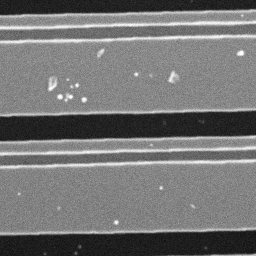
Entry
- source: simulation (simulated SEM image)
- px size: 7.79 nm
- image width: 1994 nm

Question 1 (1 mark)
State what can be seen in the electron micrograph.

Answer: lines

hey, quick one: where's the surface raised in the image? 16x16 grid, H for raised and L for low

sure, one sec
LLLLLLLLLLLLLLLL
HHHHHHHHHHHHHHHH
HHHHHHHHHHHHHHHH
HHHHHHHHHHHHHHHH
HHHHHHHHHHHHHHHH
HHHHHHHHHHHHHHHH
HHHHHHHHHHHHHHHH
LLLLLLLLLLLLLLLL
LLLLLLLLLLLLLLLL
HHHHHHHHHHHHHHHH
HHHHHHHHHHHHHHHH
HHHHHHHHHHHHHHHH
HHHHHHHHHHHHHHHH
HHHHHHHHHHHHHHHH
HHHHHHHHHHLLLLLL
LLLLLLLLLLLLLLLL